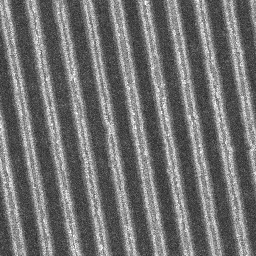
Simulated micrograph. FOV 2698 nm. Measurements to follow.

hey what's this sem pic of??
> parallel lines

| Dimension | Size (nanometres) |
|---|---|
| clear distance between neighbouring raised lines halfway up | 175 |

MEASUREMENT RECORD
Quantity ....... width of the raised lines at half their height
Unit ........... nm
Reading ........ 114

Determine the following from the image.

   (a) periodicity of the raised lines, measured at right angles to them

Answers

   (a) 0.291 microns